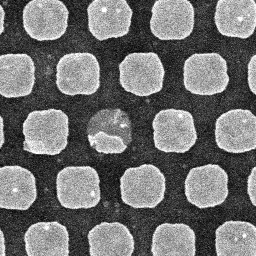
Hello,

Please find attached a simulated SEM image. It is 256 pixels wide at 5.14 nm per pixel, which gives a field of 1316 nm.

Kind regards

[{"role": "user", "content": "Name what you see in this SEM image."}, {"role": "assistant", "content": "a regular array of raised bodies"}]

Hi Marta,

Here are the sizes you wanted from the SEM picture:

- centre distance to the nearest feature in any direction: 328 nm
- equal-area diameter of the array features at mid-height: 231 nanometres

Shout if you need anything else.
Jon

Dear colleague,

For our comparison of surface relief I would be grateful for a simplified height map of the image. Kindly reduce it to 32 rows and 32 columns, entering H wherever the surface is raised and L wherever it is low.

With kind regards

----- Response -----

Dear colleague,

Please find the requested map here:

LLLLHHHHLLLHHHHHLLLHHHHHLLLHHHHH
LLLHHHHHLLLHHHHHLLLHHHHHLLLHHHHH
LLLHHHHHLLLHHHHHLLLHHHHHLLLHHHHH
LLLHHHHHLLLHHHHHLLLHHHHHLLLHHHHH
LLLLHHHLLLLLHHHLLLLLHHHLLLLLLHHL
LLLLLLLLLLLLLLLLLLLLLLLLLLLLLLLL
LLLLLLLLLLLLLLLLLLLLLLLLLLLLLLLL
HHHHLLLLHHHHLLLHHHHHLLLHHHHHLLLH
HHHHLLLHHHHHLLLHHHHHLLLHHHHHLLLH
HHHHLLLHHHHHLLLHHHHHLLLHHHHHLLLH
HHHHLLLHHHHHLLLHHHHHLLLHHHHHLLLH
HHHHLLLLHHHHLLLLHHHLLLLLHHHLLLLL
LLLLLLLLLLLLLLLLLLLLLLLLLLLLLLLL
LLLLLLLLLLLLLLLLLLLLLLLLLLLLLLLL
LLLLHHHHLLLLLLLLLLLLHHHHLLLLHHHH
LLLHHHHHLLLLLLLLLLLHHHHHLLLHHHHH
LLLHHHHHLLLLLLLLLLLHHHHHLLLHHHHH
LLLHHHHHLLLHHHHLLLLHHHHHLLLHHHHH
LLLHHHHHLLLLHHHHLLLLHHHHLLLLHHHH
LLLLLLLLLLLLLLLLLLLLLLLLLLLLLLLL
LLLLLLLLLLLLLLLLLLLLLLLLLLLLLLLL
HHHHLLLLHHHHLLLLHHHHLLLLHHHHLLLH
HHHHLLLHHHHHLLLHHHHHHLLHHHHHLLLH
HHHHLLLHHHHHLLLHHHHHHLLHHHHHLLLH
HHHHLLLHHHHHLLLHHHHHLLLHHHHHLLLH
HHHHLLLLHHHHLLLLHHHHLLLLHHHLLLLL
LLLLLLLLLLLLLLLLLLLLLLLLLLLLLLLL
LLLLLLLLLLLLLLLLLLLLLLLLLLLLLLLL
LLLLHHHHLLLLHHHHLLLLHHHHLLLHHHHH
LLLHHHHHHLLHHHHHLLLHHHHHLLLHHHHH
HLLHHHHHHLLHHHHHHLLHHHHHLLLHHHHH
HLLHHHHHLLLHHHHHHLLHHHHHLLLHHHHH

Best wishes